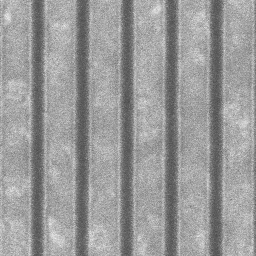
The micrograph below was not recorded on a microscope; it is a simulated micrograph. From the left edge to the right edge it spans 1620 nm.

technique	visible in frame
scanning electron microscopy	parallel lines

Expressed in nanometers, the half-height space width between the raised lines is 176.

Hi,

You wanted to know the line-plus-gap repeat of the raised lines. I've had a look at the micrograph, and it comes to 44.6 px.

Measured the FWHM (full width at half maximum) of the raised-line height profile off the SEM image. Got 103 nm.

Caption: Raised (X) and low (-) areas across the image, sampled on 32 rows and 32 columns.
----XX---XX----XX---XXX---XX----
----XX---XX----XX---XXX---XX----
----XX---XX----XX---XXX---XX----
----XX---XX----XX---XXX---XX----
----XX---XX----XX---XXX---XX----
----XX---XX----XX---XXX---XX----
----XX---XX----XX---XXX---XX----
----XX---XX----XX---XX----XX----
----XX---XX----XX---XX----XX----
----XX---XX----XX---XX----XX----
----XX---XX----XX---XX----XX----
----XX---XX----XX---XX----XX----
----XX---XX----XX---XX----XX----
----XX---XX----XX---XX----XX----
----XX---XX----XX---XX----XX----
----XX---XX----XX---XX----XX----
----XX---XX----XX---XX----XX----
----XX---XX----XX---XX----XX----
----XX---XX----XX---XX----XX----
----XX---XX----XX---XX----XX----
----XX---XX----XX---XX----XX----
----XX---XX----XX---XX----XX----
----XX---XX----XX---XX----XX----
----XX---XX----XX---XX----XX----
----XX---XX----XX---XX----XX----
----XX---XX----XX---XX----XX----
----XX---XX----XX---XX----XX----
----XX---XX----XX---XX----XX----
----XX---XX----XX---XX----XX----
----XX---XX----XX---XX----XX----
----XX---XX----XX---XX----XX----
----XX---XX----XX---XX----XX---X